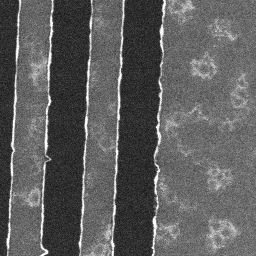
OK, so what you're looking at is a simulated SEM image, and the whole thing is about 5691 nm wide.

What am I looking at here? one or a few lines or trenches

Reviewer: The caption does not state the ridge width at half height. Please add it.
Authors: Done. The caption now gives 905 nanometers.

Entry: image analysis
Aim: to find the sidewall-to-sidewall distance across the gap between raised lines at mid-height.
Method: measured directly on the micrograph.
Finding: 716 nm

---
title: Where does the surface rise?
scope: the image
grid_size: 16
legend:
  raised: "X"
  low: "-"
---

X--XXX--XX------
X--XXX--XX------
X--XXX--XX------
X--XXX--XX------
X--XXX--XX------
X--XX--XXX------
X--XX--XXX------
X--XX--XXX------
X--XX--XXX------
X--XX--XXX------
X--XX--XXX------
X--XX--XXX------
X--XX--XXX------
X--XX--XXX------
X--XX--XXX------
X--XX--XXX------